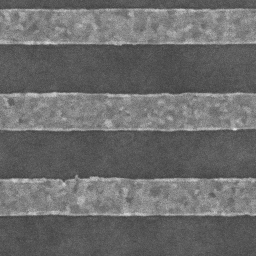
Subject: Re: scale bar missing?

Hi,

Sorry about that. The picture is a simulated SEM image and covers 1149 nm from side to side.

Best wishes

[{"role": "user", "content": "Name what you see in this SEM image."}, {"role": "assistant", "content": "one or a few lines or trenches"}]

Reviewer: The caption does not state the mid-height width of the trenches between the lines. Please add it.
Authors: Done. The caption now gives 49.9 pixels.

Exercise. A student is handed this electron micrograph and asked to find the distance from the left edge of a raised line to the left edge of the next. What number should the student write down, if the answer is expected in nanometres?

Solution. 382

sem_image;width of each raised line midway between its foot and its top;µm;0.159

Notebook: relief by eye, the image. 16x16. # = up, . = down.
................
################
################
................
................
................
################
################
................
................
................
################
################
................
................
................